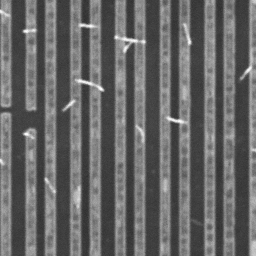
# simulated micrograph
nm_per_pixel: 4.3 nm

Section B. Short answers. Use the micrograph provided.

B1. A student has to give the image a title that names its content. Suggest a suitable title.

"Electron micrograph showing parallel lines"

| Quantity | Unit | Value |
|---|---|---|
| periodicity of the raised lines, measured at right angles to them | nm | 96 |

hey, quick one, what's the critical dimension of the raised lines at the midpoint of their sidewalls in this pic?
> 37.6 nm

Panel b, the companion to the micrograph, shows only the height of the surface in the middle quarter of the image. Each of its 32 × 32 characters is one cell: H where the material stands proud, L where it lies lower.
LLHHLLLHHLLLLHHLLLHHLLLLHHLLLHHL
LLHHLLLHHLLLLHHLLLHHLLLLHHLLLHHL
LLHHLLLHHLLLLHHLLLHHLLLLHHLLLHHL
LLHHLLLHHLLLLHHLLLHHLLLLHHLLLHHL
LLHHLLLHHLLLLHHLLLHHLLLLHHLLLHHL
LLHHLLLHHLLLLHHLLLHHLLLLHHLLLHHL
LLHHLLLHHLLLLHHLLLHHLLLLHHLLLHHL
LLHHLLLHHLLLLHHLLLHHLLLLHHLLLHHL
LLHHLLLHHLLLLHHLLLHHLLLLHHLLLHHL
LLHHLLLHHLLLLHHLLLHHLLLLHHLLLHHL
LLHHLLLHHLLLLHHLLLHHLLLLHHLLLHHL
LLHHLLLHHLLLLHHLLLHHLLLLHHLLLHHL
LLHHLLLHHLLLLHHLLLHHLLLLHHLLLHHL
LLHHLLLHHLLLLHHLLLHHLLLLHHHLLHHL
LLHHLLLHHLLLLHHLLLHHLLLLHHLLLHHL
LLHHLLLHHLLLLHHLLLHHLLLLHHLLLHHL
LLHHLLLHHLLLLHHLLLHHLLLLHHLLLHHL
LLHHLLLLHLLLLHHLLLHHLLLLHHLLLHHL
LLHHLLLHHLLLLHHLLLHHLLLLHHLLLHHL
LLHHLLLHHLLLLHHLLLHHLLLLHHLLLHHL
LLHHLLLHHLLLLHHLLLHHLLLLHHLLLHHL
LLHHLLLHHLLLLHHLLLHHLLLLHHLLLHHL
LLHHLLLHHLLLLHHLLLHHLLLLHHLLLHHL
LLHHLLLHHLLLLHHLLLHHLLLLHHLLLHHL
LLHHLLLHHLLLLHHLLLHHLLLLHHLLLHHL
LLHHLLLHHLLLLHHLLLHHLLLLHHLLLHHL
LLHHLLLHHLLLLHHLLLHHLLLLHHLLLHHL
LLHHLLLHHLLLLHHLLLHHLLLLHHLLLHHL
LLHHLLLHHLLLLHHLLLHHLLLLHHLLLHHL
LLHHLLLHHLLLLHHLLLHHLLLLHHLLLHHL
LLHHLLLHHLLLLHHLLLHHLLLLHHLLLHHL
LLHHLLLHHLLLLHHLLLHHLLLLHHLLLHHL